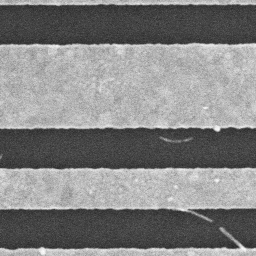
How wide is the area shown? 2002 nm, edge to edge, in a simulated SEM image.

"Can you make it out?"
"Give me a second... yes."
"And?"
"lines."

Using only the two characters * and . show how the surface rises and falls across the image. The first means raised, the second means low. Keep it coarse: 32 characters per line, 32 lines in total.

********************************
................................
................................
................................
................................
........................*.......
********************************
********************************
********************************
********************************
********************************
********************************
********************************
********************************
********************************
********************************
................................
................................
................................
................................
................................
********************************
********************************
********************************
********************************
********************************
................................
................................
................................
................................
................................
********************************